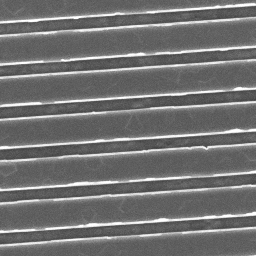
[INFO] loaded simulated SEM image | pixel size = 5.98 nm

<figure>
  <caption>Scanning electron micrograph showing parallel lines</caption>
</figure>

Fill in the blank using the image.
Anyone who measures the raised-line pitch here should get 250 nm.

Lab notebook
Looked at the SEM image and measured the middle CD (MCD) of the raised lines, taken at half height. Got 180 nm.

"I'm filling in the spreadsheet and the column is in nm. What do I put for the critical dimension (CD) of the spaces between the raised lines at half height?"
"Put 70.1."